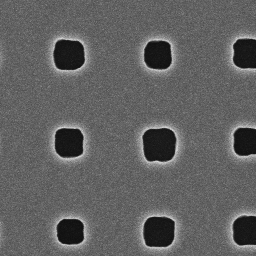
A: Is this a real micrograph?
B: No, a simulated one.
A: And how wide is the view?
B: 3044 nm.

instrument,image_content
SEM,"holes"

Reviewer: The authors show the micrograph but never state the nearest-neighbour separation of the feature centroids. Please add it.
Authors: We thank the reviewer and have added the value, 1040 nanometres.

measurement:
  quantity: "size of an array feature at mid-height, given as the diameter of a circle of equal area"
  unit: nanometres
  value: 377